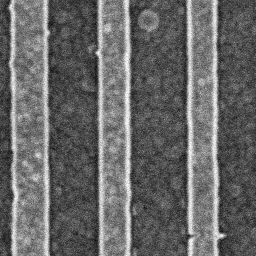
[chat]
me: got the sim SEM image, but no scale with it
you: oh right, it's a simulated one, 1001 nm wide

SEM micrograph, one or a few lines or trenches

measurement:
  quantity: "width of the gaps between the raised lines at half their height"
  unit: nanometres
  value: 225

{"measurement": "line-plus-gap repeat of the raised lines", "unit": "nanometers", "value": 338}